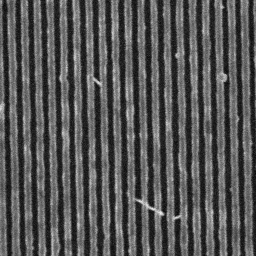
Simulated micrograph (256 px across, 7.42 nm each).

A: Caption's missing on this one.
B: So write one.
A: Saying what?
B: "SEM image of parallel lines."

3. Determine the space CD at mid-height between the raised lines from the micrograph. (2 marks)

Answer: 53.8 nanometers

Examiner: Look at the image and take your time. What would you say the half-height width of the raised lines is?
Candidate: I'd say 47.3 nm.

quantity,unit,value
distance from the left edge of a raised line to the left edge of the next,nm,96.1